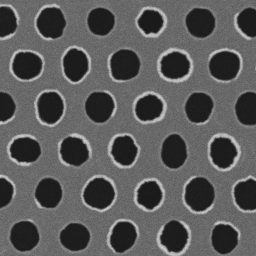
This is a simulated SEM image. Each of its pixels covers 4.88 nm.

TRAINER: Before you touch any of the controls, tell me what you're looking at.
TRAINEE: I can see a regular array of holes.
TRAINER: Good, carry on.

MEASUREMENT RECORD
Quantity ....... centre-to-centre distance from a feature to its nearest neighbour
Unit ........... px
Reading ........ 48.9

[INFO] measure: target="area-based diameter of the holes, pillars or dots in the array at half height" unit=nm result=138